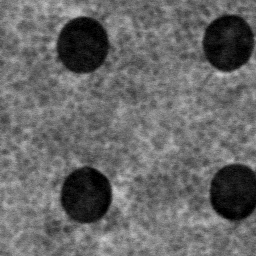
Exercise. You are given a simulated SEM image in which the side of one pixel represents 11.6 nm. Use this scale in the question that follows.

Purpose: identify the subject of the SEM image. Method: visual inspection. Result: holes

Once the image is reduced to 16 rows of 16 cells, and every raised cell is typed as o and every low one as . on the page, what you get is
oooooooooooooooo
oooo..ooooooo...
oooo...oooooo...
oooo...oooooo...
oooo..oooooooooo
oooooooooooooooo
oooooooooooooooo
oooooooooooooooo
oooooooooooooooo
oooooooooooooooo
ooooo.oooooooo..
oooo...oooooo...
oooo...oooooo...
oooo..oooooooo..
oooooooooooooooo
oooooooooooooooo